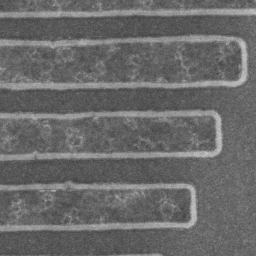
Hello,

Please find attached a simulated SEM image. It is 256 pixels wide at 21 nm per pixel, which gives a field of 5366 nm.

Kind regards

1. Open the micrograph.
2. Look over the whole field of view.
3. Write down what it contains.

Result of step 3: one or a few lines or trenches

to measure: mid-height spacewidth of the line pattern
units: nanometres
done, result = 603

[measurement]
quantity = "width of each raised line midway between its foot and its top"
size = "0.873 um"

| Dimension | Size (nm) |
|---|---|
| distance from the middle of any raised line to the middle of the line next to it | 1510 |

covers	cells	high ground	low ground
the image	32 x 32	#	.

################################
########################........
................................
................................
................................
######..######################..
##############################..
##############################..
##############################..
##############################..
#########################.......
................................
................................
................................
.#.......##################.....
###########################.....
###########################.....
###########################.....
###########################.....
######..........................
................................
................................
................................
.#######################........
########################........
########################........
########################........
########################........
................................
................................
................................
................................